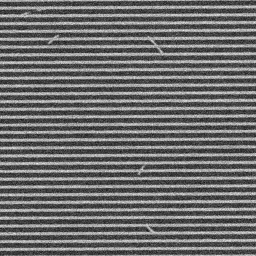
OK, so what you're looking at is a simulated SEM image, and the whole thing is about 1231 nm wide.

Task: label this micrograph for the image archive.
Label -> parallel lines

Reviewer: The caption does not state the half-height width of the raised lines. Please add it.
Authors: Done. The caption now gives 12.6 nm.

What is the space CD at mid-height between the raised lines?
0.0258 µm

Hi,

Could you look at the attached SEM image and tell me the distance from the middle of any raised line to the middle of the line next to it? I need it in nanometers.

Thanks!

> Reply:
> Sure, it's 37.4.